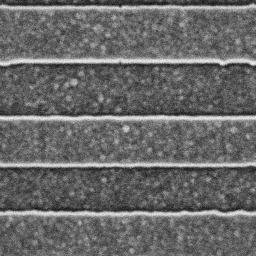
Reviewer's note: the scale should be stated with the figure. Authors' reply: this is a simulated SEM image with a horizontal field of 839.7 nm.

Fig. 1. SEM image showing one or a few lines or trenches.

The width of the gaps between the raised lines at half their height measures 168 nm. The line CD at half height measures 169 nm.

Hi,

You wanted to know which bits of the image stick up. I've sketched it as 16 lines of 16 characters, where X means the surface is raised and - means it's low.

XXXXXXXXXXXXXXXX
XXXXXXXXXXXXXXXX
XXXXXXXXXXXXXXXX
XXXXXXXXXXXXXXXX
----------------
----------------
----------------
XXXXXXXXXXXXXXXX
XXXXXXXXXXXXXXXX
XXXXXXXXXXXXXXXX
----------------
----------------
----------------
XXXXXXXXXXXXXXXX
XXXXXXXXXXXXXXXX
XXXXXXXXXXXXXXXX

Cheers